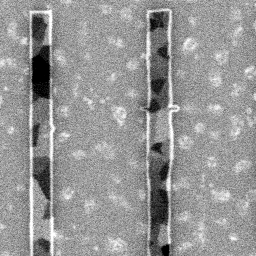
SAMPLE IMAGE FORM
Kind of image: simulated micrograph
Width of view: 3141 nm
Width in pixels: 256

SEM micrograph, one or a few lines or trenches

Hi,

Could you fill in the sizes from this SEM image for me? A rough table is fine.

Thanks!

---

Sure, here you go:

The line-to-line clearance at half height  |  1.18 microns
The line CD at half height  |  254 nm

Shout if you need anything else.